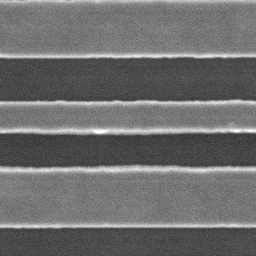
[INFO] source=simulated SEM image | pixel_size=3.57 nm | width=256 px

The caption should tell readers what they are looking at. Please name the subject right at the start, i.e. lines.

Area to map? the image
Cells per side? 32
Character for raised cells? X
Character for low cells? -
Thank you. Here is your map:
XXXXXXXXXXXXXXXXXXXXXXXXXXXXXXXX
XXXXXXXXXXXXXXXXXXXXXXXXXXXXXXXX
XXXXXXXXXXXXXXXXXXXXXXXXXXXXXXXX
XXXXXXXXXXXXXXXXXXXXXXXXXXXXXXXX
XXXXXXXXXXXXXXXXXXXXXXXXXXXXXXXX
XXXXXXXXXXXXXXXXXXXXXXXXXXXXXXXX
XXXXXXXXXXXXXXXXXXXXXXXXXXXXXXXX
--------------------------------
--------------------------------
--------------------------------
--------------------------------
--------------------------------
--------------------------------
XXXXXXXXXXXXXXXXXXXXXXXXXXXXXXXX
XXXXXXXXXXXXXXXXXXXXXXXXXXXXXXXX
XXXXXXXXXXXXXXXXXXXXXXXXXXXXXXXX
-----------XXX------------------
--------------------------------
--------------------------------
--------------------------------
--------------------------------
XXXXXXXXXXXXXXXXXXXXXXXXXXXXXXXX
XXXXXXXXXXXXXXXXXXXXXXXXXXXXXXXX
XXXXXXXXXXXXXXXXXXXXXXXXXXXXXXXX
XXXXXXXXXXXXXXXXXXXXXXXXXXXXXXXX
XXXXXXXXXXXXXXXXXXXXXXXXXXXXXXXX
XXXXXXXXXXXXXXXXXXXXXXXXXXXXXXXX
XXXXXXXXXXXXXXXXXXXXXXXXXXXXXXXX
--------------------------------
--------------------------------
--------------------------------
--------------------------------